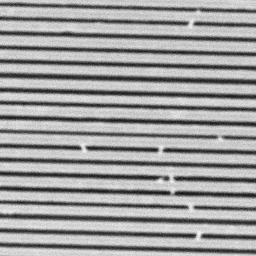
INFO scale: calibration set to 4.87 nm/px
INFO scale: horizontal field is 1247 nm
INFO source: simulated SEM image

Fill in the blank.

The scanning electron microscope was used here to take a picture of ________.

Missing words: parallel lines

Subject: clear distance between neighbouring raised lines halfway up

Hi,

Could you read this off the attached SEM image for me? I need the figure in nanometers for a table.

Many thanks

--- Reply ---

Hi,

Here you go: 23.1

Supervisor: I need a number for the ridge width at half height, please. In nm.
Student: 45.6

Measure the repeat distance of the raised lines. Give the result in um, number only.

0.0689